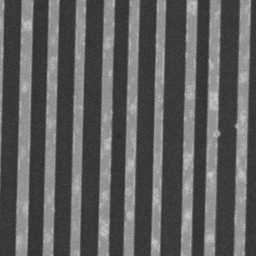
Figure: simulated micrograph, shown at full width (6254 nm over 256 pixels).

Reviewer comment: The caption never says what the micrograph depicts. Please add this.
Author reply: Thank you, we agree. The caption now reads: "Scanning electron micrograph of parallel lines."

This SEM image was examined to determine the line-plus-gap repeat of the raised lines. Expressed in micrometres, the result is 0.665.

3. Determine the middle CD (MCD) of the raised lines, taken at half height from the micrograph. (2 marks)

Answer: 241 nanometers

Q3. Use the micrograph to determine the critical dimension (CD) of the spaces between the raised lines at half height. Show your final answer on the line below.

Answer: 443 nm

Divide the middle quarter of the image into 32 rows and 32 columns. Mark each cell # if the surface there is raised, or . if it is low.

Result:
...##.....##....##.....##.....##
...##.....##....##.....##.....##
...##.....##....##.....##.....##
...##.....##....##.....##.....##
...##.....##....##.....##.....##
...##.....##....##.....##.....##
...##.....##....##.....##.....##
...##.....##....##.....##.....##
..###....###....##.....##.....##
...##....###....##.....##.....##
...##....###....##.....##.....##
...##.....##....##.....##.....##
...##.....##....##.....##.....##
...##.....##....##.....##.....##
...##.....##....##.....#......##
...##.....##....##.....#......##
...##.....##....##.....#......##
..###....###....##.....#......##
..##.....###....##.....#......##
..##.....###....##.....#......##
..##.....###....##.....#......##
..##.....###....##.....#......##
..##.....###...###....##......##
..##.....###...###....##......##
..##.....###...###....##......##
..##.....###...###....##......##
..##.....###...###....##......##
..##.....###...###....##......##
..##.....##.....##....##......##
..##.....##.....##....##......##
..##.....##.....##....##......##
..##.....##....###....##......##